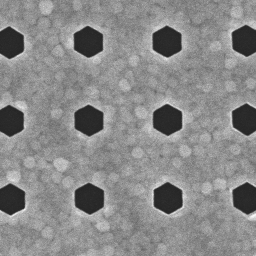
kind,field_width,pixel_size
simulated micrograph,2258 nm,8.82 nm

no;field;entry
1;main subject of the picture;holes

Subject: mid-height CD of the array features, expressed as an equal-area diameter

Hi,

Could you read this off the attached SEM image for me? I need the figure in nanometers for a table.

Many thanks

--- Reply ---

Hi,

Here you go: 271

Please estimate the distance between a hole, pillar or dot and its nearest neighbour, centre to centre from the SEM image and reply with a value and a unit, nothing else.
689 nm